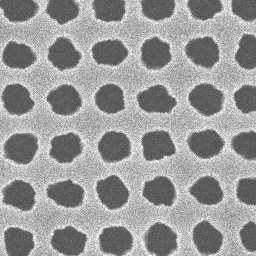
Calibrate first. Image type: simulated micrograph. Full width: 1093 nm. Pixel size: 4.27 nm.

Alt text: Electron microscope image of a regular array of holes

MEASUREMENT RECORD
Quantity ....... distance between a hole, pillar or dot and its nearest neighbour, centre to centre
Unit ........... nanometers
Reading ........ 195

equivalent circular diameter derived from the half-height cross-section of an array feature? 132 nm